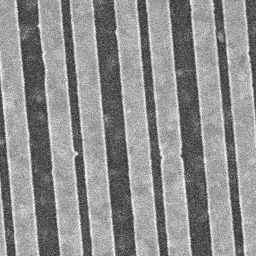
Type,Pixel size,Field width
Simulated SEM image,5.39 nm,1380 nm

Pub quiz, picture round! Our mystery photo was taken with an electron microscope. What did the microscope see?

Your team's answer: parallel lines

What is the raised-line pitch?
206 nanometers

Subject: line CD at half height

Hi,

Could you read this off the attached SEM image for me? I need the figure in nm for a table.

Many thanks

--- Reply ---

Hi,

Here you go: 120